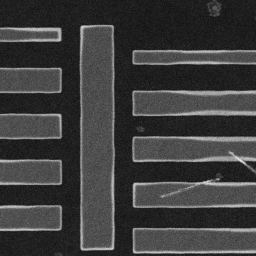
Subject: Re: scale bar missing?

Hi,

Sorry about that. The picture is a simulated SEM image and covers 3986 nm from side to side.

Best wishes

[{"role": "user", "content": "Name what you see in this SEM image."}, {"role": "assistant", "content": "groups of lines, slits or small figures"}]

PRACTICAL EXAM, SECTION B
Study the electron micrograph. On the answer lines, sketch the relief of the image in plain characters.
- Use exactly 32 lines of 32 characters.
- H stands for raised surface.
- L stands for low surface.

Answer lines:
LLLLLLLLLLLLLLLLLLLLLLLLLLLLLLLL
LLLLLLLLLLLLLLLLLLLLLLLLLLLLLLLL
LLLLLLLLLLLLLLLLLLLLLLLLLLLLLLLL
LLLLLLLLLLHHHHLLLLLLLLLLLLLLLLLL
HHHHHHHLLLHHHHLLLLLLLLLLLLLLLLLL
LLLLLLLLLLHHHHLLLLLLLLLLLLLLLLLL
LLLLLLLLLLHHHHLLLHHHHHHHHHHHHHHH
LLLLLLLLLLHHHHLLLHHHHHHHHHHHHHHH
HLLHLLHLLLHHHHLLLLLLLLLLLLLLLLLL
HHHHHHHHLLHHHHLLLLLLLLLLLLLLLLLL
HHHHHHHHLLHHHHLLLLLLLLLLLLLLLLLL
HHHHHHHLLLHHHHLLLHHHHHHLLLLLLLLH
LLLLLLLLLLHHHHLLLHHHHHHHHHHHHHHH
LLLLLLLLLLHHHHLLLHHHHHHHHHHHHHHH
HHHHHHHLLLHHHHLLLLLLLLLLLLLLLLLL
HHHHHHHHLLHHHHLLLLLLLLLLLLLLLLLL
HHHHHHHHLLHHHHLLLLLLLLLLLLLLLLLL
LLLLLLLLLLHHHHLLLHHHHHHHHHHHHHHH
LLLLLLLLLLHHHHLLLHHHHHHHHHHHHHHH
LLLLLLLLLLHHHHLLLHHHHHHHHHHHHHHH
HHHHHHHHLLHHHHLLLLLLLLLLLLLLLLLL
HHHHHHHHLLHHHHLLLLLLLLLLLLLLLLLL
HHHHHHHHLLHHHHLLLLLLLLLLLLLLLLLL
LLLLLLLLLLHHHHLLLHHHHHHHHHHHHHHH
LLLLLLLLLLHHHHLLLHHHHHHHHHHHHHHH
LLLLLLLLLLHHHHLLLHHHHHHHHHHHHHHH
HHHHHHHHLLHHHHLLLLLLLLLLLLLLLLLL
HHHHHHHHLLHHHHLLLLLLLLLLLLLLLLLL
HHHHHHHLLLHHHHLLLLLLLLLLLLLLLLLL
LLLLLLLLLLHHHHLLLHHHHHHHHHHHHHHH
LLLLLLLLLLHHHHLLLHHHHHHHHHHHHHHH
LLLLLLLLLLLLLLLLLHHHHHHHHHHHHHHH